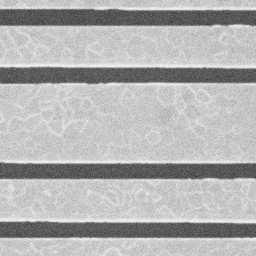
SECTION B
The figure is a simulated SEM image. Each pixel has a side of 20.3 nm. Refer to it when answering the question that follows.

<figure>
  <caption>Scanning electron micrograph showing lines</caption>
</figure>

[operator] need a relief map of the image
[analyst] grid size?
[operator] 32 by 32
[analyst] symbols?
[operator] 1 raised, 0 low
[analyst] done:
11111111111111111111111111111111
00000000000000000000000000000000
00000000000000000000000000000000
11111111111111111111111111111111
11111111111111111111111111111111
11111111111111111111111111111111
11111111111111111111111111111111
11111111111111111111111111111111
00000000000000000000000000000000
00000000000000000000000000000000
00000000000000000000000000000000
11111111111111111111111111111111
11111111111111111111111111111111
11111111111111111111111111111111
11111111111111111111111111111111
11111111111111111111111111111111
11111111111111111111111111111111
11111111111111111111111111111111
11111111111111111111111111111111
11111111111111111111111111111111
00000000000000000000000000000000
00000000000000000000000000000000
00000000000000000000000001100111
11111111111111111111111111111111
11111111111111111111111111111111
11111111111111111111111111111111
11111111111111111111111111111111
00011111111111111111111111111111
00000000000000000000000000000000
00000000000000000000000000000000
11111111111111111111111111111111
11111111111111111111111111111111